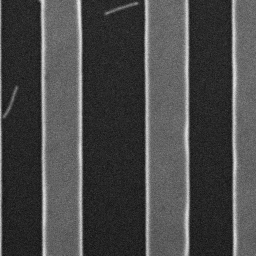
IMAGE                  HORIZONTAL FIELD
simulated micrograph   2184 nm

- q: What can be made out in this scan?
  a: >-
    groups of lines, slits or small figures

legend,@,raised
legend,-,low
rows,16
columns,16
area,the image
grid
---@@----@@@---@
---@@----@@@---@
---@@----@@@---@
---@@----@@@---@
---@@----@@@---@
---@@----@@@---@
---@@----@@@---@
---@@----@@@---@
---@@----@@@---@
---@@----@@@---@
---@@----@@@---@
---@@----@@@---@
---@@----@@@---@
---@@----@@@---@
---@@----@@@---@
---@@----@@@---@